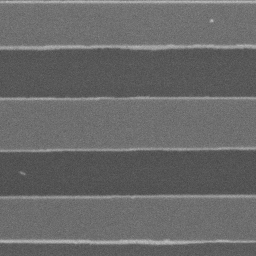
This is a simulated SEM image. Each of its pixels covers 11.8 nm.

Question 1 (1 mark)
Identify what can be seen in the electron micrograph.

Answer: lines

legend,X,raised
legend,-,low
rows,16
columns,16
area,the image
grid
XXXXXXXXXXXXXXXX
XXXXXXXXXXXXXXXX
XXXXXXXXXXXXXXXX
----------------
----------------
----------------
XXXXXXXXXXXXXXXX
XXXXXXXXXXXXXXXX
XXXXXXXXXXXXXXXX
----------------
----------------
----------------
XXXXXXXXXXXXXXXX
XXXXXXXXXXXXXXXX
XXXXXXXXXXXXXXXX
----------------